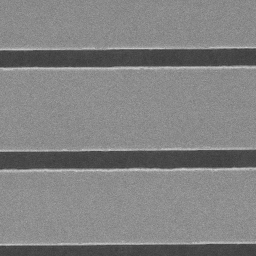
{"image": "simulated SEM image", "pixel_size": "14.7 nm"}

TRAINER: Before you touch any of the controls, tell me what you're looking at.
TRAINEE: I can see lines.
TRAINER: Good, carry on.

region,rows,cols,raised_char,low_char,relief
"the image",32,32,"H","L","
HHHHHHHHHHHHHHHHHHHHHHHHHHHHHHHH
HHHHHHHHHHHHHHHHHHHHHHHHHHHHHHHH
HHHHHHHHHHHHHHHHHHHHHHHHHHHHHHHH
HHHHHHHHHHHHHHHHHHHHHHHHHHHHHHHH
HHHHHHHHHHHHHHHHHHHHHHHHHHHHHHHH
HHHHHHHHHHHHHHHHHHHHHHHHHHHHHHHH
LLLLLLLLLLLLLLLLLLLLLLLLLLLLLLLL
LLLLLLLLLLLLLLLLLLLLLLLLLLLLLLLL
HLHHHHHHHHHHHHHHHHHHHHHHHHHHHHHH
HHHHHHHHHHHHHHHHHHHHHHHHHHHHHHHH
HHHHHHHHHHHHHHHHHHHHHHHHHHHHHHHH
HHHHHHHHHHHHHHHHHHHHHHHHHHHHHHHH
HHHHHHHHHHHHHHHHHHHHHHHHHHHHHHHH
HHHHHHHHHHHHHHHHHHHHHHHHHHHHHHHH
HHHHHHHHHHHHHHHHHHHHHHHHHHHHHHHH
HHHHHHHHHHHHHHHHHHHHHHHHHHHHHHHH
HHHHHHHHHHHHHHHHHHHHHHHHHHHHHHHH
HHHHHHHHHHHHHHHHHHHHHHHHHHHHHHHH
HHHHHHHHHHHHHHHHHHHHHHHHHHHHHHHH
LLLLLLLLLLLLLLLLLLLLLLLLLLLLLLLL
LLLLLLLLLLLLLLLLLLLLLLLLLLLLLLLL
HHHHHHHHHHHHHHHHHHHHHHHHHHHHHHHH
HHHHHHHHHHHHHHHHHHHHHHHHHHHHHHHH
HHHHHHHHHHHHHHHHHHHHHHHHHHHHHHHH
HHHHHHHHHHHHHHHHHHHHHHHHHHHHHHHH
HHHHHHHHHHHHHHHHHHHHHHHHHHHHHHHH
HHHHHHHHHHHHHHHHHHHHHHHHHHHHHHHH
HHHHHHHHHHHHHHHHHHHHHHHHHHHHHHHH
HHHHHHHHHHHHHHHHHHHHHHHHHHHHHHHH
HHHHHHHHHHHHHHHHHHHHHHHHHHHHHHHH
HHHHHHHHHHHHHHHHHHHHHHHHHLLLLLLL
LLLLLLLLLLLLLLLLLLLLLLLLLLLLLLLL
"